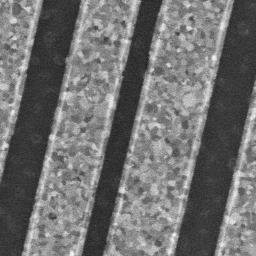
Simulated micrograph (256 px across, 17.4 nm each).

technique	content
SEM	one or a few lines or trenches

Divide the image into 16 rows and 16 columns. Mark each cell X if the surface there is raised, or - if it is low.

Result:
XX---XXX--XXXX--
XX---XXX--XXXX--
XX---XXX--XXXX--
XX---XXX--XXX---
X---XXX--XXXX---
X---XXX--XXXX---
X---XXX--XXXX---
X---XXX--XXXX---
---XXX--XXXX---X
---XXX--XXXX---X
---XXX--XXXX---X
---XXX--XXXX---X
--XXXX--XXX----X
--XXX--XXXX---XX
--XXX--XXXX---XX
--XXX--XXXX---XX